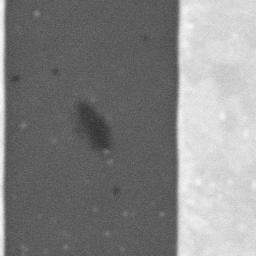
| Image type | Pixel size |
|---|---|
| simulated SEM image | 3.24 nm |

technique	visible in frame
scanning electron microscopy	wiring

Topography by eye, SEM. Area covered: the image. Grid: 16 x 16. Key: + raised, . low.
...........+++++
...........+++++
...........+++++
...........+++++
...........+++++
...........+++++
...........+++++
...........+++++
...........+++++
...........+++++
...........+++++
...........+++++
...........+++++
...........+++++
...........+++++
...........+++++